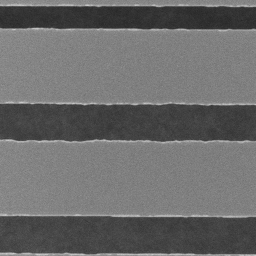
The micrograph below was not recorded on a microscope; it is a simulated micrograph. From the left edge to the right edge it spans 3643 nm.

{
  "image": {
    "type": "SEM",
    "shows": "lines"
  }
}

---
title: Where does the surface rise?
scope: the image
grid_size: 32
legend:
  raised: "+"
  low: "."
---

++++++++++++++++++++++++++++++++
................................
................................
................................
++++++++++++++++++++++++++++++++
++++++++++++++++++++++++++++++++
++++++++++++++++++++++++++++++++
++++++++++++++++++++++++++++++++
++++++++++++++++++++++++++++++++
++++++++++++++++++++++++++++++++
++++++++++++++++++++++++++++++++
++++++++++++++++++++++++++++++++
++++++++++++++++++++++++++++++++
................................
................................
................................
................................
................................
++++++++++++++++++++++++++++++++
++++++++++++++++++++++++++++++++
++++++++++++++++++++++++++++++++
++++++++++++++++++++++++++++++++
++++++++++++++++++++++++++++++++
++++++++++++++++++++++++++++++++
++++++++++++++++++++++++++++++++
++++++++++++++++++++++++++++++++
++++++++++++++++++++++++++++++++
................................
................................
................................
................................
................................